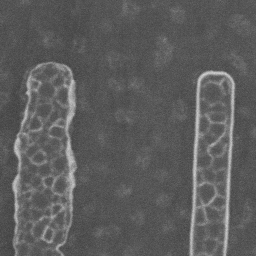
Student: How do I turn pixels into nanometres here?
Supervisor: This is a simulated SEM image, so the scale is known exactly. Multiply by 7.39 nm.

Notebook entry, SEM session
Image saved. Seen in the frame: one or a few lines or trenches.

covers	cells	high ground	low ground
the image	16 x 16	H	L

LLLLLLLLLLLLLLLL
LLLLLLLLLLLLLLLL
LLLLLLLLLLLLLLLL
LLLLLLLLLLLLLLLL
LLHHLLLLLLLLLLLL
LLHHLLLLLLLLHHHL
LLHHLLLLLLLLHHHL
LHHHLLLLLLLLHHHL
LHHHLLLLLLLLHHLL
LHHHLLLLLLLLHHLL
LHHHLLLLLLLLHHLL
LHHHLLLLLLLLHHLL
LHHHLLLLLLLLHHLL
LHHHLLLLLLLLHHLL
LHHHLLLLLLLLHHLL
LHHHLLLLLLLLHHLL